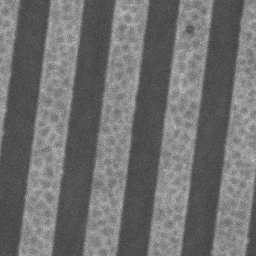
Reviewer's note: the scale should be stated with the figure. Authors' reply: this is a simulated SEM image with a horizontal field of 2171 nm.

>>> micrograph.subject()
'parallel lines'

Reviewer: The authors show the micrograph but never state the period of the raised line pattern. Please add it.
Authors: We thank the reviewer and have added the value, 543 nanometers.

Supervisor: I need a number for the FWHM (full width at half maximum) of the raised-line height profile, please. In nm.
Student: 266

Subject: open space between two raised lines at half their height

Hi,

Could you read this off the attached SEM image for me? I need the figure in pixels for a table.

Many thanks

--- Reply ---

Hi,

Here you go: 32.3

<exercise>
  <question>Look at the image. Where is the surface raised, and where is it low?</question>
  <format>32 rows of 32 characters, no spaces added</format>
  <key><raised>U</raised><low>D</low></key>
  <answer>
UUDDDDUUUUDDDDDUUUDDDDDUUUDDDDDU
UUDDDDUUUUDDDDUUUUDDDDDUUUDDDDUU
UUDDDDUUUUDDDDUUUUDDDDUUUUDDDDUU
UUDDDDUUUUDDDDUUUUDDDDUUUUDDDDUU
UUDDDDUUUUDDDDUUUUDDDDUUUUDDDDUU
UUDDDDUUUUDDDDUUUUDDDDUUUUDDDDUU
UDDDDDUUUUDDDDUUUUDDDDUUUUDDDDUU
UDDDDDUUUDDDDDUUUDDDDDUUUUDDDDUU
UDDDDUUUUDDDDDUUUDDDDDUUUUDDDDUU
UDDDDUUUUDDDDUUUUDDDDUUUUDDDDUUU
UDDDDUUUUDDDDUUUUDDDDUUUUDDDDUUU
UDDDDUUUUDDDDUUUUDDDDUUUUDDDDUUU
UDDDDUUUUDDDDUUUUDDDDUUUUDDDDUUU
UDDDDUUUUDDDDUUUUDDDDUUUUDDDDUUU
UDDDDUUUDDDDDUUUUDDDDUUUUDDDDUUU
DDDDDUUUDDDDDUUUDDDDDUUUUDDDDUUU
DDDDUUUUDDDDUUUUDDDDDUUUDDDDDUUU
DDDDUUUUDDDDUUUUDDDDUUUUDDDDUUUU
DDDDUUUUDDDDUUUUDDDDUUUUDDDDUUUU
DDDDUUUUDDDDUUUUDDDDUUUUDDDDUUUU
DDDDUUUUDDDDUUUUDDDDUUUUDDDDUUUU
DDDDUUUUDDDDUUUUDDDDUUUUDDDDUUUU
DDDUUUUUDDDDUUUUDDDDUUUUDDDDUUUU
DDDUUUUDDDDDUUUDDDDDUUUUDDDDUUUU
DDDUUUUDDDDUUUUDDDDDUUUDDDDDUUUD
DDDUUUUDDDDUUUUDDDDUUUUDDDDUUUUD
DDDUUUUDDDDUUUUDDDDUUUUDDDDUUUUD
DDDUUUUDDDDUUUUDDDDUUUUDDDDUUUUD
DDDUUUUDDDDUUUUDDDDUUUUDDDDUUUUD
DDDUUUUDDDDUUUUDDDDUUUUDDDDUUUUD
DDDUUUDDDDDUUUUDDDDUUUUDDDDUUUUD
DDUUUUDDDDDUUUUDDDDUUUUDDDUUUUUD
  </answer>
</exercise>